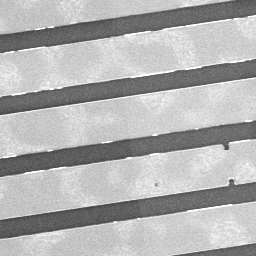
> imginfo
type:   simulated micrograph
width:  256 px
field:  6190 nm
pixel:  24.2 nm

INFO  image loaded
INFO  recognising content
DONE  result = one or a few lines or trenches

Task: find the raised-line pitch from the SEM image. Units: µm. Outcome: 1.47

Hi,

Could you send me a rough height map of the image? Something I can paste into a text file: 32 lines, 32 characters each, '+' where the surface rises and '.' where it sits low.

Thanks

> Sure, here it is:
+++++++++++++++++++++++++.......
+++++++++++++++++++.............
++++++++++++.................+++
+++++.................++++++++++
...............+++++++++++++++++
.........+++++++++++++++++++++++
..++++++++++++++++++++++++++++++
+++++++++++++++++++++++++++++++.
++++++++++++++++++++++++........
+++++++++++++++++...............
+++++.++++.................+++++
++++................++++++++++++
..............++++.+++++++++++++
.......+++++++++++++++++++++++++
++++++++++++++++++++++++++++++++
++++++++++++++++++++++++++++....
++++++++++++++++++++++..........
+++++++++++++++.................
++++++++.................+++++++
+.................++++++++++++++
...........+++++++++++++++++++++
.....+++++++++++++..++++++++++++
++++++++++++++++++...+++++++++++
+++++++++++++++++++..++++++.....
+++++++++++++++++++.............
+++++++++++++.................++
++++++.................+++++++++
.................+++++++++++++++
..........++++++++++++++++++++++
...++...++++++++++++++++++++++++
+++++++++++++++++++++++++++++++.
++++++++++++++++++++++++........